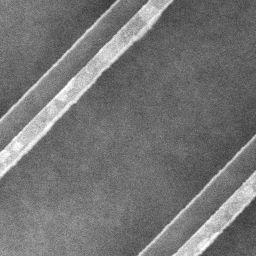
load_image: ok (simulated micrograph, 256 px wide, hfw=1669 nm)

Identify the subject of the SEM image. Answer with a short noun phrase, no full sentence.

lines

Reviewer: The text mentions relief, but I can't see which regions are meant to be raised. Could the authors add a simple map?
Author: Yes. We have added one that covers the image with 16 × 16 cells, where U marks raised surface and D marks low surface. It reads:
DDDDDDDUUUDDDDDD
DDDDDDUUUDDDDDDD
DDDDDUUUDDDDDDDD
DDDDUUUDDDDDDDDD
DDDUUUDDDDDDDDDD
DDUUUDDDDDDDDDDD
DUUUDDDDDDDDDDDD
UUUDDDDDDDDDDDDD
UUDDDDDDDDDDDDDD
UDDDDDDDDDDDDDDU
UDDDDDDDDDDDDDUU
DDDDDDDDDDDDDUUU
DDDDDDDDDDDDUUUU
DDDDDDDDDDDUUUUD
DDDDDDDDDDUUUUDD
DDDDDDDDDUUUUDDD